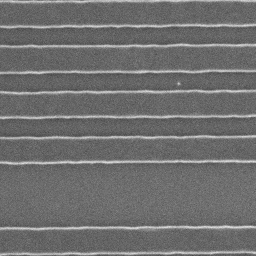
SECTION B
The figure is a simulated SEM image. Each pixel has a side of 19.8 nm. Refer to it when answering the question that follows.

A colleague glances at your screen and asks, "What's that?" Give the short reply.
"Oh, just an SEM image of wiring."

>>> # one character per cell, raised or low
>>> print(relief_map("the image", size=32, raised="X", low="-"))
XXXXXXXXXXXXXXXXXXXXXXXXXXXXXXXX
XXXXXXXXXXXXXXXXXXXXXXXXXXXXXXXX
XXXXXXXXXXXXXXXXXXXXXXXXXXXXXXXX
--------------------------------
--------------------------------
--------------------------------
XXXXXXXXXXXXXXXXXXXXXXXXXXXXXXXX
XXXXXXXXXXXXXXXXXXXXXXXXXXXXXXXX
XXXXXXXXXXXXXXXXXXXXXXXXXXXXXXXX
--------------------------------
--------------------------------
X------XXXXXXXXXXXXXXXXXXXXXXXXX
XXXXXXXXXXXXXXXXXXXXXXXXXXXXXXXX
XXXXXXXXXXXXXXXXXXXXXXXXXXXXXXXX
XXXXXXXXXXXXXXXXXXXXXXXXXXXXXXXX
--------------------------------
--------------------------------
XXXXXXXXXXXXXXXXXXXXXXXXXXXXXXXX
XXXXXXXXXXXXXXXXXXXXXXXXXXXXXXXX
XXXXXXXXXXXXXXXXXXXXXXXXXXXXXXXX
--------------------------------
--------------------------------
--------------------------------
--------------------------------
--------------------------------
--------------------------------
--------------------------------
--------------------------------
--------XXXXXXXXXXXXXXXXXXXXXXXX
XXXXXXXXXXXXXXXXXXXXXXXXXXXXXXXX
XXXXXXXXXXXXXXXXXXXXXXXXXXXXXXXX
XXXXXXXXXXXXXXXXXXXXXXXXXXXXXXXX